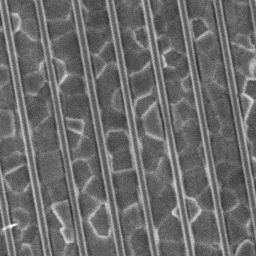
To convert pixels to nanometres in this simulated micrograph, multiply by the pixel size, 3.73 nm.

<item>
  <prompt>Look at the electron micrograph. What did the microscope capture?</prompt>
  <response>parallel lines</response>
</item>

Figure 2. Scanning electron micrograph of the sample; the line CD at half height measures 24.3 nm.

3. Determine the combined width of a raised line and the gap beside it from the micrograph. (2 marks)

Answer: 131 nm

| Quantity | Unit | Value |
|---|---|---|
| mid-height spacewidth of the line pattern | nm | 106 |